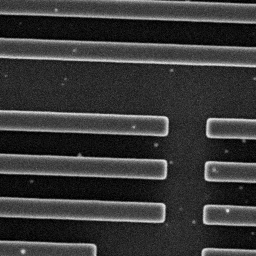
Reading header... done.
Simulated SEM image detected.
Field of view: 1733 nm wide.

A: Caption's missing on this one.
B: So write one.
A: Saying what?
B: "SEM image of groups of lines, slits or small figures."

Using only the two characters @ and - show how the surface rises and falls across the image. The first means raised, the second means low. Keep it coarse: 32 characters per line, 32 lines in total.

@@@@@@@@@@@@@@@@@@@@@@@@@@@@@---
@@@@@@@@@@@@@@@@@@@@@@@@@@@@@@@@
-----------------------@@@@@@@@@
--------------------------------
--------------------------------
@@@@@@@@@@@@@@@@@@--------------
@@@@@@@@@@@@@@@@@@@@@@@@@@@@@@@@
-----------@@@@@@@@@@@@@@@@@@@@@
--------------------------------
--------------------------------
--------------------------------
--------------------------------
--------------------------------
--------------------------------
@@@@@@@@@@@@@@@@----------------
@@@@@@@@@@@@@@@@@@@@@-----@@@@@@
----------@@@@@@@@@@@-----@@@@@@
--------------------------------
--------------------------------
@@@@----------------------------
@@@@@@@@@@@@@@@@@@@@@-----@@@@@@
@@@@@@@@@@@@@@@@@@@@@-----@@@@@@
--------------------------@@@@@@
--------------------------------
--------------------------------
@@@@@@@@@@@@@@@@@@@@------------
@@@@@@@@@@@@@@@@@@@@@-----@@@@@@
------------@@@@@@@@------@@@@@@
--------------------------------
--------------------------------
@@@@@@@@@@----------------------
@@@@@@@@@@@@-------------@@@@@@@